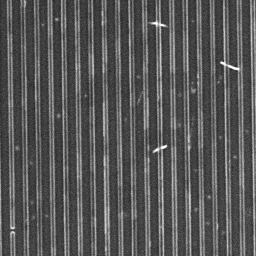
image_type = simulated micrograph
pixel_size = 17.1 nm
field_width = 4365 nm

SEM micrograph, parallel lines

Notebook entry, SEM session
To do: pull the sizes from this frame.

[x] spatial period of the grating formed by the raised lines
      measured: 230 nanometers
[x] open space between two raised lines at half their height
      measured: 164 nanometres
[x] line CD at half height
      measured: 3.5 pixels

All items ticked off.